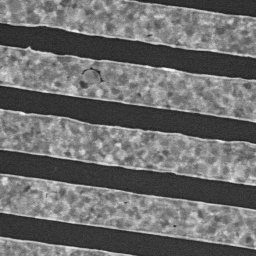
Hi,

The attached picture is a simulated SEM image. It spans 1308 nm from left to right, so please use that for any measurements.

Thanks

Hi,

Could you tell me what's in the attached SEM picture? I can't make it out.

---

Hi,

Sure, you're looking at one or a few lines or trenches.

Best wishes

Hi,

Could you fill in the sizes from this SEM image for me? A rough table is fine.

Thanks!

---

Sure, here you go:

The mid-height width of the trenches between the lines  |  24.5 pixels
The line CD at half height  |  195 nm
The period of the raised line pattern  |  321 nm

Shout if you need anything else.